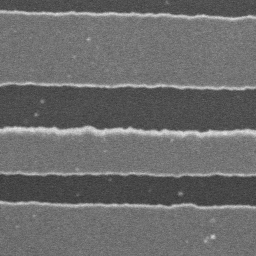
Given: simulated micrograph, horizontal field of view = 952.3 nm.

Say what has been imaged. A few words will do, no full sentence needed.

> lines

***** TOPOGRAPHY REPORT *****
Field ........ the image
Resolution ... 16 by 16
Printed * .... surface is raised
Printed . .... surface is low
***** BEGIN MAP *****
................
****************
****************
****************
****************
...........*****
................
................
****************
****************
****************
................
................
****************
****************
****************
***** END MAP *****